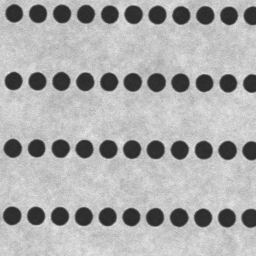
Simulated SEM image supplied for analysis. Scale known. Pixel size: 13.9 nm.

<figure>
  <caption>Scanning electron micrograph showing a regular array of holes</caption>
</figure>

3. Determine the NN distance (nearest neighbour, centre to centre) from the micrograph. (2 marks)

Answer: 0.328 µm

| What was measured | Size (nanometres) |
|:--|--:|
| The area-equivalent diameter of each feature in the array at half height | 254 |